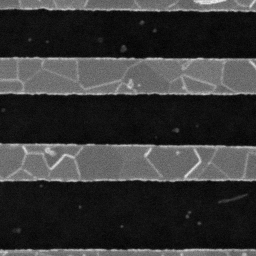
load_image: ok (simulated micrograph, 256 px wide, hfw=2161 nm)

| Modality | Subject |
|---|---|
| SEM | lines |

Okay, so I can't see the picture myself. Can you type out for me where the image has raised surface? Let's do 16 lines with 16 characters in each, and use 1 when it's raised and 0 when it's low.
1111111111111111
0000000000000000
0000000000000000
0000000000000000
1111111111111111
1111111111111111
0000000000000000
0000000000000000
0000000000000000
1111111111111111
1111111111111111
0000000000000000
0000000000000000
0000000000000000
0000000000000000
0000000000000000